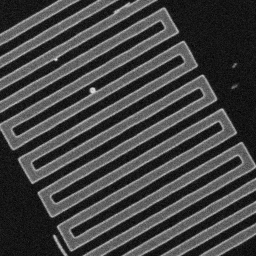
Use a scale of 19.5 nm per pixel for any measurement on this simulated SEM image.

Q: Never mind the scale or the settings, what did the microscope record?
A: groups of lines, slits or small figures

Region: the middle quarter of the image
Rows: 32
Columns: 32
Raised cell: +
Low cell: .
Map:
++++.....+++++.....+++++.....+++
+++.....++++.....+++++.....+++++
+.....+++++.....++++.....+++++..
....+++++.....+++++.....++++....
..+++++.....+++++.....++++......
+++++.....+++++.....+++++.....++
++++...+.++++.....+++++.....++++
++.....++++......++++.....+++++.
.....+++++.....+++++.....++++...
....++++.....+++++.....+++++....
..++++.....+++++.....+++++.....+
+++++.....++++......++++.....+++
+++.....+++++.....+++++....+++++
+.....+++++.....+++++....+++++..
.....++++.....+++++.....+++++...
...++++.....+++++.....+++++.....
.+++++.....++++.....+++++.....++
++++.....+++++.....++++.....++++
++.....+++++.....+++++.....++++.
+....+++++.....+++++.....+++++..
....++++.....+++++.....+++++....
..+++++.....+++++....+++++.....+
+++++.....+++++.....+++++....+++
+++.....+++++.....+++++.....++++
++.....++++.....+++++.....+++++.
.....+++++.....++++.....+++++...
...+++++.....+++++.....++++.....
.+++++.....+++++.....++++.....++
++++.....+++++.....+++++.....+++
+++.....+++++....+++++.....+++++
+.....+++++.....++++.....+++++..
....+++++.....+++++.....++++....